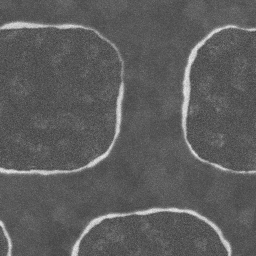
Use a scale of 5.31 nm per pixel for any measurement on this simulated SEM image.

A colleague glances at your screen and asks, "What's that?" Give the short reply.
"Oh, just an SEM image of holes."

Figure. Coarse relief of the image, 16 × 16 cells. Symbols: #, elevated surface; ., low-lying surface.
################
#.##############
.......######...
.......#####....
........####....
........####....
.......#####....
.......#####....
.......#####....
.......#####....
.....#########..
################
################
########....####
#####.........##
.####.........##